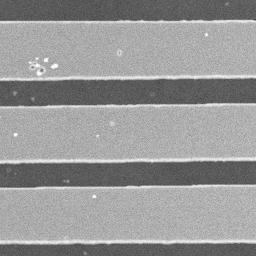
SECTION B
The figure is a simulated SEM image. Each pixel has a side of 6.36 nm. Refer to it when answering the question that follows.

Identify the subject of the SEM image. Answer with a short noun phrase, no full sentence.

lines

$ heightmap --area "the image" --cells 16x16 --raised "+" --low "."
................
++++++++++++++++
++++++++++++++++
++++++++++++++++
++++++++++++++++
................
................
++++++++++++++++
++++++++++++++++
++++++++++++++++
................
................
++++++++++++++++
++++++++++++++++
++++++++++++++++
................